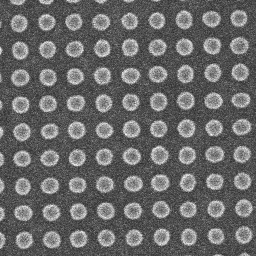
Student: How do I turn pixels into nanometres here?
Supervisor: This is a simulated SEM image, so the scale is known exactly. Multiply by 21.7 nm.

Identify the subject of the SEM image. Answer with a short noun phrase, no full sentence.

a regular array of raised bodies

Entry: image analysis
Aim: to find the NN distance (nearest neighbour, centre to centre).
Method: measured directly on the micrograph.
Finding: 580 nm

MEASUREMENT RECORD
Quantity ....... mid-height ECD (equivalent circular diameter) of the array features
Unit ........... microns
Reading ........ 0.349